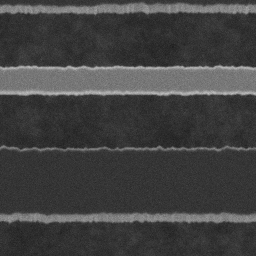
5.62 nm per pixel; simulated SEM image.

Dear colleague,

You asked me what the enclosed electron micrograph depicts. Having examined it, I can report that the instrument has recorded lines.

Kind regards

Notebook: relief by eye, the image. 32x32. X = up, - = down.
XXXXXXXXXXXXXXXXXXXXXXXXXXXXXXXX
--------------------------------
--------------------------------
--------------------------------
--------------------------------
--------------------------------
--------------------------------
--------------------------------
XXXXXXXXXXXXXXXXXXXXXXXXXXXXXXXX
XXXXXXXXXXXXXXXXXXXXXXXXXXXXXXXX
XXXXXXXXXXXXXXXXXXXXXXXXXXXXXXXX
XXXXXXXXXXXXXXXXXXXXXXXXXXXXXXXX
--------------------------------
--------------------------------
--------------------------------
--------------------------------
--------------------------------
--------------------------------
XX--X-X-----XX--X-XX-XX-XXX-XX-X
XXXXXXXXXXXXXXXXXXXXXXXXXXXXXXXX
XXXXXXXXXXXXXXXXXXXXXXXXXXXXXXXX
XXXXXXXXXXXXXXXXXXXXXXXXXXXXXXXX
XXXXXXXXXXXXXXXXXXXXXXXXXXXXXXXX
XXXXXXXXXXXXXXXXXXXXXXXXXXXXXXXX
XXXXXXXXXXXXXXXXXXXXXXXXXXXXXXXX
XXXXXXXXXXXXXXXXXXXXXXXXXXXXXXXX
XXXXXXXXXXXXXXXXXXXXXXXXXXXXXXXX
--------------------------------
--------------------------------
--------------------------------
--------------------------------
--------------------------------